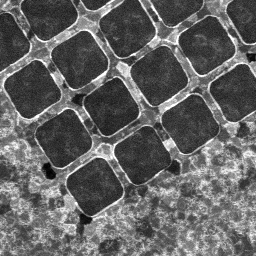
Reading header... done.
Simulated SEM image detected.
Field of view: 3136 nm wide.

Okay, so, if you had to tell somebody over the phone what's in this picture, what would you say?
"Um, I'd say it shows a regular array of holes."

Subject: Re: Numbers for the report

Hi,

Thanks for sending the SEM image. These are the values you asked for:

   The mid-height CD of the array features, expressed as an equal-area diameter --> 0.65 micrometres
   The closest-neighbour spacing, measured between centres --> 695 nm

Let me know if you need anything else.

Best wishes